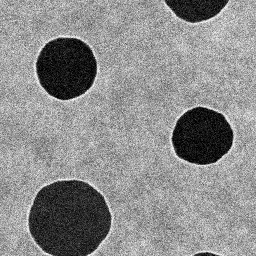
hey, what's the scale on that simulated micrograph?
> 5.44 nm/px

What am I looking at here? holes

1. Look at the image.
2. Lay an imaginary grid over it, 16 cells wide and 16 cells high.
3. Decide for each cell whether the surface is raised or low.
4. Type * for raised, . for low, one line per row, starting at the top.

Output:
***********...**
****************
***..***********
**....**********
**....**********
***...**********
****************
***********...**
***********....*
***********...**
****************
***..***********
**.....*********
**.....*********
**.....*********
***...**********